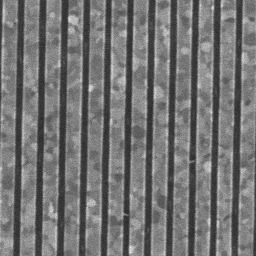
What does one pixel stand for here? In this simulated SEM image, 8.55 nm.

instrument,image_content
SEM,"parallel lines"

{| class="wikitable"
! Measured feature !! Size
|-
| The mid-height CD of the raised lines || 116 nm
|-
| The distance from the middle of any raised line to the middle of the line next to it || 187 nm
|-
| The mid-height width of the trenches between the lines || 0.0652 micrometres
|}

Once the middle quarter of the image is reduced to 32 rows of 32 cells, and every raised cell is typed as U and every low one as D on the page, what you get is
DUUUDDDUUUDDUUUDDUUUUDDUUUDDUUUU
DUUUDDDUUUDDUUUDDUUUUDDUUUDDUUUU
DUUUDDUUUUDDUUUDDUUUUDDUUUDDUUUU
DUUUDDUUUUDDUUUDDUUUUDDUUUDDUUUD
DUUUDDUUUUDDUUUDDUUUDDDUUUDDUUUD
DUUUDDUUUUDDUUUDDUUUUDDUUUDDUUUD
DUUUDDUUUUDDUUUDDUUUUDDUUUDDUUUD
DUUUDDUUUUDDUUUDDUUUDDDUUUDDUUUD
DUUUDDUUUUDDUUUDDUUUDDDUUUDDUUUD
DUUUDDUUUUDDUUUDDUUUDDDUUUDDUUUD
DUUUDDUUUUDDUUUDDUUUDDDUUUDDUUUD
DUUUDDUUUUDDUUUDDUUUUDDUUUDDUUUD
DUUUDDUUUUDDUUUDDUUUUDDUUUDDUUUD
DUUUDDUUUUDDUUUDDUUUDDDUUUDDUUUD
DUUUDDUUUUDDUUUDDUUUDDDUUUDDUUUD
DUUUDDUUUUDDUUUDDUUUDDDUUUDDUUUD
DUUUDDUUUDDDUUUDDUUUDDDUUUDDUUUD
DUUUDDUUUDDDUUUDDUUUDDUUUUDDUUUD
DUUUDDUUUDDDUUUDDUUUDDUUUUDDUUUD
DUUUDDUUUDDDUUUDDUUUDDUUUUDDUUUD
DUUUDDUUUDDDUUUDDUUUDDUUUUDDUUUD
DUUUDDUUUDDDUUUDDUUUDDUUUUDDUUUD
DUUUDDUUUDDDUUUDDUUUDDUUUUDDUUUD
DUUUDDUUUDDUUUUDDUUUDDUUUUDDUUUD
UUUUDDUUUDDUUUUDDUUUDDUUUUDDUUUD
UUUUDDUUUDDUUUUDDUUUDDUUUUDDUUUD
UUUUDDUUUDDUUUUDDUUUDDUUUUDDUUUD
UUUUDDUUUDDUUUUDDUUUDDUUUUDDUUUD
UUUUDDUUUDDUUUUDDUUUDDUUUUDDUUUD
DUUUDDUUUDDUUUUDDUUUDDUUUUDDUUUD
DUUUDDUUUDDUUUUDDUUUDDUUUDDDUUUD
DUUUDDUUUDDUUUUDDUUUDDUUUDDDUUUD